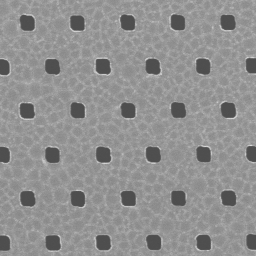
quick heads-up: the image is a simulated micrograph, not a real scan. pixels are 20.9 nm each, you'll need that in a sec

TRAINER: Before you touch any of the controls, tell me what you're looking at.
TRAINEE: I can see a regular array of holes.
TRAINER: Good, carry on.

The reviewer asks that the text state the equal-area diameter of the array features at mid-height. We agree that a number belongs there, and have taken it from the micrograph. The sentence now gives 347 nm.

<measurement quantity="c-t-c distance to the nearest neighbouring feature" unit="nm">1050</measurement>